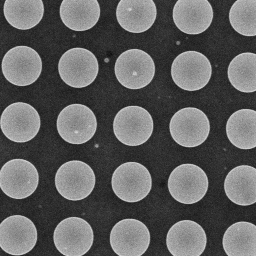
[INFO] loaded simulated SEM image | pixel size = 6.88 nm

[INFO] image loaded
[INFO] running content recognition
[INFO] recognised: an array of small figures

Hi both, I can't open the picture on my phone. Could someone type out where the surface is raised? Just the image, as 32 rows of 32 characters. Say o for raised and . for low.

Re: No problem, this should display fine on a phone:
.oooo...oooo...oooo...oooo...ooo
ooooo...oooo...ooooo..ooooo..ooo
.oooo...oooo...oooo...oooo...ooo
..oo.....oo....oooo...oooo...ooo
................................
................................
.oooo...ooo.....oo.....oo.......
ooooo..ooooo...oooo...oooo...ooo
ooooo..ooooo..ooooo..ooooo...ooo
.oooo...oooo...oooo..ooooo...ooo
..oo....ooo....ooo....oooo...ooo
..............................o.
................................
.ooo....ooo....ooo.....o........
ooooo..ooooo..ooooo...oooo...ooo
ooooo..ooooo..ooooo..ooooo..oooo
ooooo..ooooo..ooooo..ooooo..oooo
.ooo....ooo....ooo....oooo...ooo
..............................oo
................................
.ooo....ooo....oo...............
ooooo..ooooo..ooooo...oooo...ooo
ooooo..ooooo..ooooo..ooooo..oooo
ooooo..ooooo..ooooo..ooooo..oooo
.ooo....ooo....ooo....oooo..oooo
..............................o.
................................
.ooo....ooo....oo...............
oooo...oooo...oooo...oooo....ooo
ooooo..ooooo..ooooo..ooooo..oooo
oooo...ooooo..ooooo..ooooo..oooo
.oo.....ooo...oooo...oooo...oooo